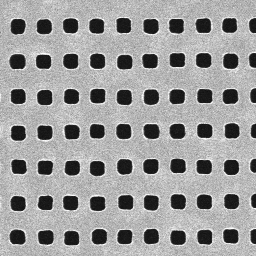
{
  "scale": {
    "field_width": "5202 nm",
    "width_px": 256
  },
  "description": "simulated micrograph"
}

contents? a regular array of holes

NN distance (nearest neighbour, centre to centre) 0.531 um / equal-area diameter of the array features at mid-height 329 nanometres